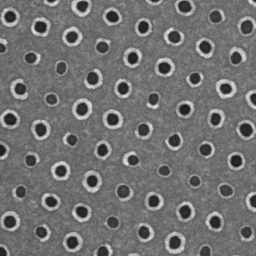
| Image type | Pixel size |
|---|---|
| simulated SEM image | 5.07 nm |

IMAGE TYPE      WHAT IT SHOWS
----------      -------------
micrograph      a regular array of holes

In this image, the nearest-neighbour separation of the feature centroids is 32.1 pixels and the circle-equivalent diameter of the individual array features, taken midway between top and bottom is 63.8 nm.